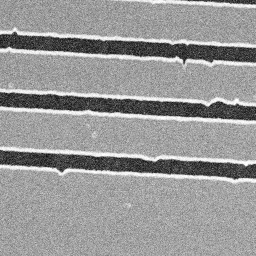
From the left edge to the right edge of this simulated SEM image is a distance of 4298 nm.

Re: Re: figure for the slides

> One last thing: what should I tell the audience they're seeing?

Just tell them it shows parallel lines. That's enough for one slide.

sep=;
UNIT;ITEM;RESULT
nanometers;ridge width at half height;668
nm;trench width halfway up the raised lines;298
